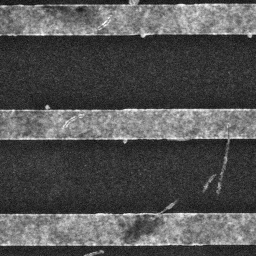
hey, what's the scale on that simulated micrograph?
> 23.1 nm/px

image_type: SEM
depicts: lines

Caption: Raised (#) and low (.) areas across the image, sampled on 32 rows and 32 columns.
................................
################################
################################
################################
................................
................................
................................
................................
................................
................................
................................
................................
................................
................................
################################
################################
################################
................................
................................
................................
................................
................................
................................
................................
................................
................................
................................
################################
################################
################################
################################
................................